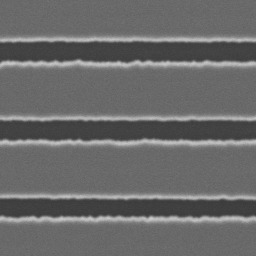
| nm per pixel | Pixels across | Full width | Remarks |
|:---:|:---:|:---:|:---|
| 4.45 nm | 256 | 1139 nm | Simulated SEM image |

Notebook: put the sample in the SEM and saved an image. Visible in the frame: lines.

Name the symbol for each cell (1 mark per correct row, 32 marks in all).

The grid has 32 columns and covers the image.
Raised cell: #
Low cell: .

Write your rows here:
################################
################################
################################
################################
################################
................................
................................
................................
################################
################################
################################
################################
################################
################################
################################
................................
................................
#.......#........###...........#
################################
################################
################################
################################
################################
################################
################################
................................
................................
################################
################################
################################
################################
################################